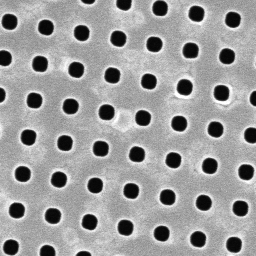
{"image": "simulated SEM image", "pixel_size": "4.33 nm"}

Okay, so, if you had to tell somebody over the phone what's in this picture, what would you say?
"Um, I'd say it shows a regular array of holes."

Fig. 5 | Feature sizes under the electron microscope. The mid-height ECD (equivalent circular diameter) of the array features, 66.1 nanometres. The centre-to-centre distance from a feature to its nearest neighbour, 158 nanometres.